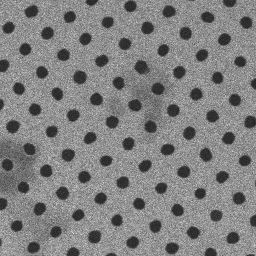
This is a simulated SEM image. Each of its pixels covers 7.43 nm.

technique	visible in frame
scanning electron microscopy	a regular array of holes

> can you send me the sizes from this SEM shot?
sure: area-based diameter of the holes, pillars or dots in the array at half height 0.0907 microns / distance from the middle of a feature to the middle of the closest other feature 202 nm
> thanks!